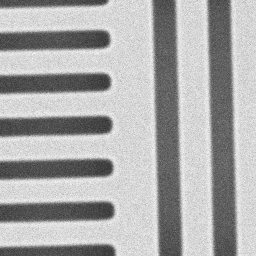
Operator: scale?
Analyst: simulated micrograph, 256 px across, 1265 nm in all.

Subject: groups of lines, slits or small figures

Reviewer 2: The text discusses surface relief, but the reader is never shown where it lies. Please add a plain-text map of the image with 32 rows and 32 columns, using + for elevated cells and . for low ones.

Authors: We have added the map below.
.............++++++...++++...+++
+++++++++++++++++++...++++...+++
+++++++++++++++++++...++++...+++
+++++++++++++++++++...++++...+++
..............+++++...++++...+++
..............+++++...++++...+++
.++++++++++++++++++...++++...+++
+++++++++++++++++++...++++...+++
+++++++++++++++++++...++++...+++
..............+++++...++++...+++
..............+++++...++++...+++
.............++++++...++++...+++
+++++++++++++++++++...++++...+++
+++++++++++++++++++....+++...+++
+++++++++....++++++....+++...+++
..............+++++....+++...+++
..............+++++....+++...+++
+++++++++++++++++++....+++...+++
+++++++++++++++++++....+++...+++
+++++++++++++++++++....+++...+++
..............+++++....+++....++
..............+++++....+++....++
.....++++++++++++++....+++....++
+++++++++++++++++++....+++....++
++++++++++++++++++++...+++....++
..............++++++...+++....++
..............++++++...+++....++
..............++++++...+++....++
++++++++++++++++++++...+++....++
++++++++++++++++++++...+++....++
++++++++++++.+++++++...+++....++
...............+++++...++++...++